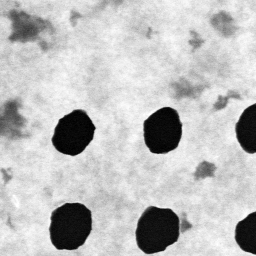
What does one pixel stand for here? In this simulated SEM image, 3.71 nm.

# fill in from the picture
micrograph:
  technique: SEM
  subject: holes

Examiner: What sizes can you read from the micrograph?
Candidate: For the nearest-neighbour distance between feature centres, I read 0.326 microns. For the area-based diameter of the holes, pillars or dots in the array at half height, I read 163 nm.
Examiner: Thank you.